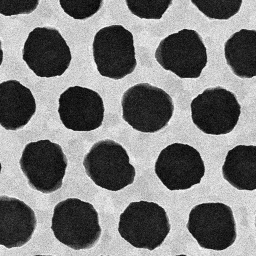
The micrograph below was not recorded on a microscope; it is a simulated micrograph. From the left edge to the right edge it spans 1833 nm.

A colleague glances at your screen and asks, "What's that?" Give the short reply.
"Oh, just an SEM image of a regular array of holes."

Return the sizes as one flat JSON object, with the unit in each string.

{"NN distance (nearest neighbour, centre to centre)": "0.471 micrometres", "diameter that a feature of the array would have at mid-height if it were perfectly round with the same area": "347 nm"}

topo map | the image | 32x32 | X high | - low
-----XX------XXX-----XXX------XX
----XXXX----XXXXX----XXXX-----XX
XXXXXXXXXXXXXXXXXXXXXXXXXXXXXXXX
XXXXXXXXXXXXX---XXXXXXXXXXXXXXXX
XXX-----XXXX-----XXXX----XXXX---
XXX-----XXXX-----XXX-----XXX----
XXX------XXX-----XXX------XX----
XXX------XXX-----XXX------XX----
XXXX----XXXX-----XXX-----XXXX---
XXXXX--XXXXXX---XXXXXX---XXXXX--
---XXXXXXXXXXXXXXXXXXXXXXXXXXXXX
----XXXX----XXXX-----XXXX----XXX
----XXX------XX------XXX------XX
----XXX------XX-------XX------XX
----XXX------XX------XXX------XX
---XXXXX-----XXX-----XXX------XX
XXXXXXXXXXXXXXXXXX-XXXXXXX---XXX
XXXXX-XXXXXXXXXXXXXXXXXXXXXXXXXX
XXX-----XXXX---XXXXXX---XXXXX---
XXX-----XXX-----XXXX-----XXX----
XXX-----XXX-----XXX------XXX----
XXX-----XXX------XX------XXX----
XXXX----XXXX-----XXX-----XXX----
XXXXX--XXXXXX--XXXXXX--XXXXXXX--
XXXXXXXXXXXXXXXXXXXXXXXXXXXXXXXX
---XXXX----XXXXX----XXXXX---XXXX
----XXX-----XXX------XXX-----XXX
----XX------XXX------XXX-----XXX
----XX-------XX------XXX-----XXX
----XXX-----XXX------XXX------XX
---XXXXX---XXXXX----XXXXX----XXX
XXXXXXXXXXXXXXXXXXXXXXXXXXXXXXXX